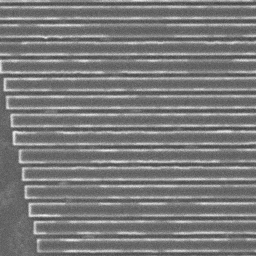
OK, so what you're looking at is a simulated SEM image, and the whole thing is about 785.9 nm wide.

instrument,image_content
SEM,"parallel lines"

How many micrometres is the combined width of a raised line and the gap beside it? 0.0551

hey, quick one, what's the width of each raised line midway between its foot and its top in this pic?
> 39.6 nanometres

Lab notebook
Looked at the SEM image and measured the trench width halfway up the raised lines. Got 13.8 nm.